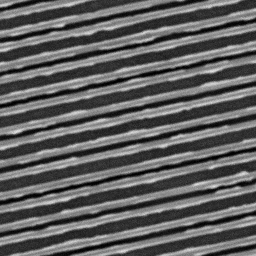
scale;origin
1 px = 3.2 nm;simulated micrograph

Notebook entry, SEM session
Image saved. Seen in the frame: parallel lines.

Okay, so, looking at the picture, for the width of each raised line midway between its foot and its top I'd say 26.2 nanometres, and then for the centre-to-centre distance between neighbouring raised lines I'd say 15.7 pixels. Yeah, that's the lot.